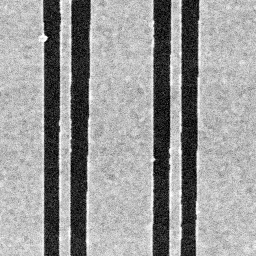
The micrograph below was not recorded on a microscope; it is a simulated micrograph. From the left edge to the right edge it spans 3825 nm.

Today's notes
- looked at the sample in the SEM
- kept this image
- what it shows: lines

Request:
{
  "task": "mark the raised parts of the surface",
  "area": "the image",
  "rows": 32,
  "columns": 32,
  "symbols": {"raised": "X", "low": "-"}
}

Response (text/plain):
XXXXX---X--XXXXXXXX--XX--XXXXXXX
XXXXX---X--XXXXXXXX--XX--XXXXXXX
XXXXX---X--XXXXXXXX--XX--XXXXXXX
XXXXX---X--XXXXXXXX--XX--XXXXXXX
XXXXXX--X--XXXXXXXX--XX--XXXXXXX
XXXXXX--X--XXXXXXXX--XX--XXXXXXX
XXXXX---X--XXXXXXXX--XX--XXXXXXX
XXXXX---X--XXXXXXXX--XX--XXXXXXX
XXXXX---X--XXXXXXXX--XX--XXXXXXX
XXXXX---X--XXXXXXXX--XX--XXXXXXX
XXXXX---X--XXXXXXXX--XX--XXXXXXX
XXXXX---X--XXXXXXXX--XX--XXXXXXX
XXXXX---X--XXXXXXXX--XX--XXXXXXX
XXXXX---X--XXXXXXXX--XX--XXXXXXX
XXXXX---X--XXXXXXXX--XX--XXXXXXX
XXXXX--XX--XXXXXXXX--XX--XXXXXXX
XXXXX--XX--XXXXXXXX--XX--XXXXXXX
XXXXX--XX--XXXXXXXX--X---XXXXXXX
XXXXX--XX--XXXXXXXX--XX--XXXXXXX
XXXXX--XX--XXXXXXXX--XX--XXXXXXX
XXXXX--XX--XXXXXXXX--XX--XXXXXXX
XXXXX--XX--XXXXXXXX--XX--XXXXXXX
XXXXX--XX--XXXXXXXX--XX--XXXXXXX
XXXXX--XX--XXXXXXXX--XX--XXXXXXX
XXXXX--XX--XXXXXXXX--XX--XXXXXXX
XXXXX--XX--XXXXXXXX--XX--XXXXXXX
XXXXX--XX--XXXXXXXX--XX--XXXXXXX
XXXXX--XX--XXXXXXXX--XX--XXXXXXX
XXXXX--XX--XXXXXXXX--XX--XXXXXXX
XXXXX--XX--XXXXXXXX--XX--XXXXXXX
XXXXX--XX--XXXXXXXX--X---XXXXXXX
XXXXX--XX--XXXXXXXX--X---XXXXXXX